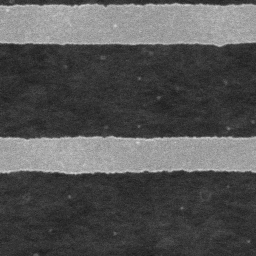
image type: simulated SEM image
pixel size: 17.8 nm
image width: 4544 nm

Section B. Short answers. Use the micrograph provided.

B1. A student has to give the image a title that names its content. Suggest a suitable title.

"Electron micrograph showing one or a few lines or trenches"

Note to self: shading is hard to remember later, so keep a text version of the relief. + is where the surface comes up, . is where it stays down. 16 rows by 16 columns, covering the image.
++++++++++++++++
++++++++++++++++
++++++++++++++++
................
................
................
................
................
................
++++++++++++++++
++++++++++++++++
................
................
................
................
................